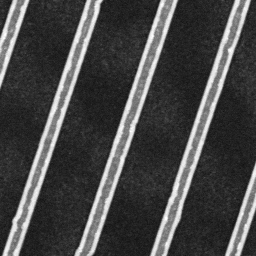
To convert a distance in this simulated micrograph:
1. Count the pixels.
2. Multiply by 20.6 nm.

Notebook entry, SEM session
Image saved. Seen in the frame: one or a few lines or trenches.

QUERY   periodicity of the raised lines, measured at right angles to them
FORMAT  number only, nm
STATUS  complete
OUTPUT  1450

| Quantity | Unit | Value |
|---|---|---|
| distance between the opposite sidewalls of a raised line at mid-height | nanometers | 237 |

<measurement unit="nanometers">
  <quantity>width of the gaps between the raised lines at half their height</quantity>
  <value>1210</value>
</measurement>